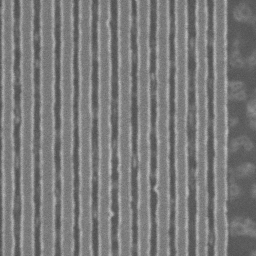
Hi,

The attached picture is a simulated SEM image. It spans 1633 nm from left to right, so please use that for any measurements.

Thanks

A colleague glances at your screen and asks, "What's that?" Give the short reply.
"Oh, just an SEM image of parallel lines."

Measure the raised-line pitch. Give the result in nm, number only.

123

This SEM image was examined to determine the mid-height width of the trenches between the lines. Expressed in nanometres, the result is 55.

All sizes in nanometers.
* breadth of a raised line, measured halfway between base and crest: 67.7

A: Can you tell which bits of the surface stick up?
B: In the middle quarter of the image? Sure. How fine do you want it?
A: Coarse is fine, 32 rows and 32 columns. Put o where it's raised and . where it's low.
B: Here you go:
oo..ooo..ooo..ooo..oo...oo..ooo.
oo..ooo..ooo..ooo..oo..ooo..ooo.
oo..oo...ooo..ooo..oo..ooo..ooo.
oo..oo...oo...ooo..oo..ooo..ooo.
oo..oo...oo...ooo..oo...oo..ooo.
oo..oo...oo...ooo..oo...oo..ooo.
oo..ooo..oo...ooo..oo..ooo..ooo.
oo..ooo..oo...ooo..oo..ooo..ooo.
oo..ooo..ooo..ooo..oo...oo..ooo.
oo..ooo..ooo..ooo..oo...oo..ooo.
oo..ooo..oo...ooo..oo..ooo..ooo.
oo..ooo..ooo..ooo..oo...oo..ooo.
oo..ooo..ooo..ooo..oo...oo..ooo.
oo..ooo..oo...ooo..oo..ooo..oo..
oo..ooo..oo...ooo..oo..ooo..oo..
oo..ooo..oo...ooo..oo..ooo..oo..
oo..ooo..ooo..ooo..oo..ooo..ooo.
oo..ooo..ooo..ooo..oo...oo..ooo.
oo..ooo..oo...oo...oo..ooo..ooo.
oo..ooo..oo...ooo..oo...oo..ooo.
oo..ooo..oo...ooo..oo...oo..ooo.
oo..ooo..ooo..ooo..oo...oo..oo..
oo..ooo..ooo..ooo..oo...oo..ooo.
oo..ooo..oo...ooo..oo...oo..ooo.
oo..ooo..oo...ooo..oo...oo..ooo.
oo..ooo..oo...oo...oo...oo..ooo.
oo..ooo..oo...oo...oo...oo..ooo.
oo..ooo..oo...oo...oo...oo..ooo.
oo..ooo..ooo..oo...oo..ooo..ooo.
oo..ooo..oo...oo...oo..ooo..ooo.
oo..ooo..oo...oo...oo..ooo..ooo.
oo..ooo..oo...oo...oo..ooo..ooo.